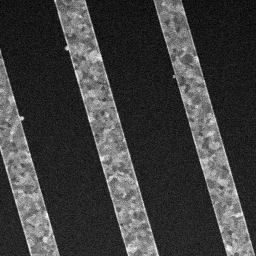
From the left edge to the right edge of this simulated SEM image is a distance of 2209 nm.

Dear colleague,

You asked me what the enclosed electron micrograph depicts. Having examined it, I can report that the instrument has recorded one or a few lines or trenches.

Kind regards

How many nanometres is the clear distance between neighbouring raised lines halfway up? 576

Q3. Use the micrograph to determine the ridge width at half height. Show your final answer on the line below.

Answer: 227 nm